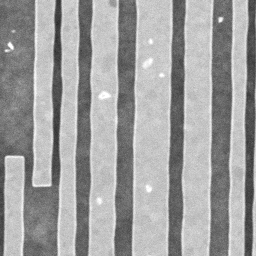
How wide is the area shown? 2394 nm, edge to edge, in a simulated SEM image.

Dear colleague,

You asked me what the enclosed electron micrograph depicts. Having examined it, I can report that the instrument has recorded groups of lines, slits or small figures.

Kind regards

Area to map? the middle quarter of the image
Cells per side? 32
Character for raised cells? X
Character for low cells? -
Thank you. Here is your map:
XXX----XXXXXX-----XXXXXXXXX---XX
XXX----XXXXXX-----XXXXXXXXX---XX
XXX----XXXXXX-----XXXXXXXXX----X
XXX----XXXXXX-----XXXXXXXXX---XX
XXX----XXXXXX-----XXXXXXXXX---XX
XXX----XXXXXX-----XXXXXXXXX---XX
XXX----XXXXXX-----XXXXXXXXX---XX
XXX----XXXXXX-----XXXXXXXXX---XX
XXX----XXXXXX-----XXXXXXXXX---XX
XXX----XXXXXX-----XXXXXXXXX---XX
XXX----XXXXXX-----XXXXXXXX----XX
XXX----XXXXXX-----XXXXXXXX----XX
XXX----XXXXXX-----XXXXXXXX----XX
XXX----XXXXXX-----XXXXXXXX----XX
XXX----XXXXXX-----XXXXXXXX----XX
XXX----XXXXXX-----XXXXXXXX----XX
XXX----XXXXXX-----XXXXXXXX----XX
XXX----XXXXXX-----XXXXXXXX----XX
XXX----XXXXXX-----XXXXXXXX----XX
XXX----XXXXXX-----XXXXXXXX----XX
XXX----XXXXXX-----XXXXXXXX----XX
XXX----XXXXXX-----XXXXXXXX----XX
XXX----XXXXXX-----XXXXXXXX----XX
XXX----XXXXXX-----XXXXXXXX----XX
XXX----XXXXXX-----XXXXXXXX----XX
XXX----XXXXXX-----XXXXXXXX----XX
XXX----XXXXXX-----XXXXXXXX----XX
XXX----XXXXXX-----XXXXXXXX----XX
XXX----XXXXXX-----XXXXXXXX----XX
XXX----XXXXXX-----XXXXXXXX----XX
XXX----XXXXXX-----XXXXXXXX----XX
XXX----XXXXXX-----XXXXXXXX----XX